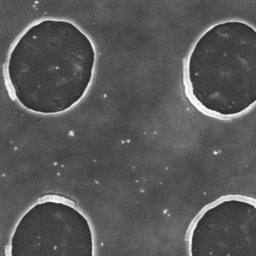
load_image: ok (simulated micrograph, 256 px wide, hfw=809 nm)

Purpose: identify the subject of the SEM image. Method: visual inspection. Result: holes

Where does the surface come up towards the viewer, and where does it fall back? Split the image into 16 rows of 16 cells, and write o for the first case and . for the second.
oooooooooooooooo
oo..oooooooooo.o
o.....oooooo....
o.....oooooo....
o.....oooooo....
o....ooooooo....
o....oooooooo...
oooooooooooooooo
oooooooooooooooo
oooooooooooooooo
oooooooooooooooo
oooooooooooooooo
oooooooooooooooo
oo...oooooooo...
o.....oooooo....
o.....oooooo....